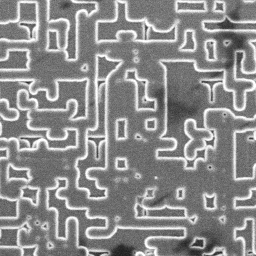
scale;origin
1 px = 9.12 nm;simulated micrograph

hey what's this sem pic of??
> wiring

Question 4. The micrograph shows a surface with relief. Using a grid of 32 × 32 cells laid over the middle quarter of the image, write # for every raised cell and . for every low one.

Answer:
########.....############.......
########.....############.......
########...#####..#######.......
########...#####..########......
......##...#######...#####......
......##...#######..######......
......##..########..######......
......##..########..######......
......##..########...#####......
.##...##..########.....###......
.##...##..########.....###......
###...##..################......
###...##..################......
##..####..################......
########..####.######..###....##
########..###..######..###....##
#..###....###..###########....##
#..###....###..##########......#
...###.....###.##########.......
...###.....#################...#
...###....##################..##
######....##############......##
######....#############.......##
#####.....######################
###.......###..###############..
###.......###..###############..
####..##########################
####..##########################
####..##########################
.##.....########################
.##.....########################
######....###########.##########